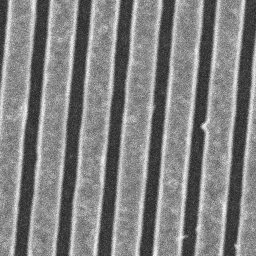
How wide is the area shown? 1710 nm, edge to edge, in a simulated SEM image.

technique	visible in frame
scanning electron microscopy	parallel lines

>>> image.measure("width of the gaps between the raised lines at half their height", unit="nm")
102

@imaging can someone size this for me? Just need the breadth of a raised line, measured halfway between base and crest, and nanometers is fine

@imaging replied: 173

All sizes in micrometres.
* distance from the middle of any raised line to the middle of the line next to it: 0.277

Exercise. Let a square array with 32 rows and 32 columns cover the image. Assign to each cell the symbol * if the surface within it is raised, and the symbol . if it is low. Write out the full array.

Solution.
.***..****..***..***..***..***..
.***..****..***..***..***..***..
.***..***..****..***..***..***..
.***..***..***...***..***..***..
.***..***..***..****..***..***..
.***..***..***..****..***..***..
.***..***..***..***..****..***..
.***..***..***..***..****..***..
****..***..***..***..****..***..
****..***..***..***..****.****..
****..***..***..***..***..***...
****.****..***..***..***..***...
***..***...***..***..***..***..*
***..***...***..***..***..***..*
***..***..****..***..***..***..*
***..***..***..****..***..***..*
***..***..***..****..***..***..*
***..***..***..****.****..***..*
***..***..***..***..****..***..*
***..***..***..***..****..***..*
***..***..***..***..***..****..*
***..***..***..***..***..****..*
**..****..***..***..***..****.**
**..****..***..***..***..***..**
**..****.****..***..***..***..**
**..***..****..***..***..***..**
**..***..***...***..***..***..**
**..***..***..****..***..***..**
**..***..***..****..***..***..**
**..***..***..***...***..***..**
**..***..***..***..****..***..**
**..***..***..***..****..***..**